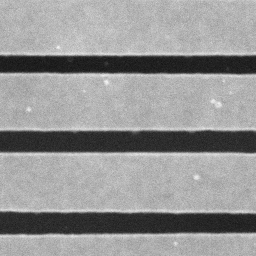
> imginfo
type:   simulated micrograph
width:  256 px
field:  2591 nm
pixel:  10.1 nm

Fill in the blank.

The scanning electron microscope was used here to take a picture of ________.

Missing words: lines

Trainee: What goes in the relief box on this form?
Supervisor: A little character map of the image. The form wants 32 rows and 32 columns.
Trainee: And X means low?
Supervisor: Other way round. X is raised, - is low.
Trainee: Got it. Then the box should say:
XXXXXXXXXXXXXXXXXXXXXXXXXXXXXXXX
XXXXXXXXXXXXXXXXXXXXXXXXXXXXXXXX
XXXXXXXXXXXXXXXXXXXXXXXXXXXXXXXX
XXXXXXXXXXXXXXXXXXXXXXXXXXXXXXXX
XXXXXXXXXXXXXXXXXXXXXXXXXXXXXXXX
XXXXXXXXXXXXXXXXXXXXXXXXXXXXXXXX
XXXXXXXXXXXXXXXXXXXXXXXXXXXXXXXX
--------------------------------
--------------------------------
XXXXXXXXXXXXXXXXXXXXXXXXXXXXXXXX
XXXXXXXXXXXXXXXXXXXXXXXXXXXXXXXX
XXXXXXXXXXXXXXXXXXXXXXXXXXXXXXXX
XXXXXXXXXXXXXXXXXXXXXXXXXXXXXXXX
XXXXXXXXXXXXXXXXXXXXXXXXXXXXXXXX
XXXXXXXXXXXXXXXXXXXXXXXXXXXXXXXX
XXXXXXXXXXXXXXXXXXXXXXXXXXXXXXXX
--------------------------------
--------------------------------
--------------------------------
XXXXXXXXXXXXXXXXXXXXXXXXXXXXXXXX
XXXXXXXXXXXXXXXXXXXXXXXXXXXXXXXX
XXXXXXXXXXXXXXXXXXXXXXXXXXXXXXXX
XXXXXXXXXXXXXXXXXXXXXXXXXXXXXXXX
XXXXXXXXXXXXXXXXXXXXXXXXXXXXXXXX
XXXXXXXXXXXXXXXXXXXXXXXXXXXXXXXX
XXXXXXXXXXXXXXXXXXXXXXXXXXXXXXXX
-------XX------XXX-XXXXXXXXXXXXX
--------------------------------
--------------------------------
XXXXXXXXXXXXXXXXXXXXXXXXXXXXXXXX
XXXXXXXXXXXXXXXXXXXXXXXXXXXXXXXX
XXXXXXXXXXXXXXXXXXXXXXXXXXXXXXXX